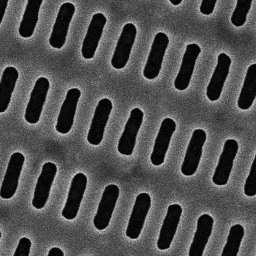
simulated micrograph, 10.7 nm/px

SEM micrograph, a regular array of holes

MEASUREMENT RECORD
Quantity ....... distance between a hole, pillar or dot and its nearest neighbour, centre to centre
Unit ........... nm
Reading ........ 352